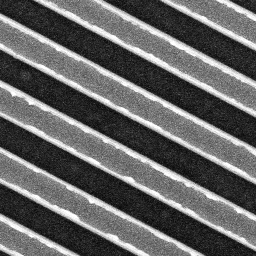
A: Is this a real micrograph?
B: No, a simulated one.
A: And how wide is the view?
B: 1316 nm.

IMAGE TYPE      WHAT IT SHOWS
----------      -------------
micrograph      parallel lines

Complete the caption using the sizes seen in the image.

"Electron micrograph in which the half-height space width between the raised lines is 156 nanometres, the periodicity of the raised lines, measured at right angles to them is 304 nanometres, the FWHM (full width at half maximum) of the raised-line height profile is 146 nm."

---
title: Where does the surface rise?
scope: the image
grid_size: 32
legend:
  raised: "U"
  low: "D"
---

DDDDDDUUUUUUUDDDDDDDDUUUUUUUUDDD
DDDDDDDUUUUUUUUDDDDDDDDUUUUUUUUD
UDDDDDDDDUUUUUUUUDDDDDDDDUUUUUUU
UUUDDDDDDDDUUUUUUUUDDDDDDDDUUUUU
UUUUUDDDDDDDDUUUUUUUUDDDDDDDDUUU
UUUUUUUDDDDDDDDUUUUUUUUDDDDDDDDU
DUUUUUUUUDDDDDDDDUUUUUUUDDDDDDDD
DDDUUUUUUUUDDDDDDDDUUUUUUUDDDDDD
DDDDDUUUUUUUUDDDDDDDDUUUUUUUDDDD
DDDDDDDUUUUUUUDDDDDDDDDUUUUUUUDD
UDDDDDDDDUUUUUUUDDDDDDDDDUUUUUUU
UUDDDDDDDDDUUUUUUUDDDDDDDDUUUUUU
UUUUDDDDDDDDDUUUUUUUDDDDDDDDUUUU
UUUUUUDDDDDDDDUUUUUUUUDDDDDDDDUU
UUUUUUUUDDDDDDDDUUUUUUUUDDDDDDDD
DDUUUUUUUUDDDDDDDDUUUUUUUUDDDDDD
DDDDUUUUUUUUDDDDDDDDUUUUUUUUDDDD
DDDDDDUUUUUUUUDDDDDDDDUUUUUUUUDD
DDDDDDDDUUUUUUUUDDDDDDDDUUUUUUUD
UUDDDDDDDDUUUUUUUUDDDDDDDDUUUUUU
UUUUDDDDDDDDUUUUUUUDDDDDDDDDUUUU
UUUUUDDDDDDDDDUUUUUUUDDDDDDDDDUU
UUUUUUUDDDDDDDDDUUUUUUUDDDDDDDDU
DDUUUUUUUDDDDDDDDUUUUUUUUDDDDDDD
DDDDUUUUUUUDDDDDDDDUUUUUUUUDDDDD
DDDDDUUUUUUUUDDDDDDDDUUUUUUUUDDD
DDDDDDDUUUUUUUUDDDDDDDDUUUUUUUUD
UDDDDDDDDUUUUUUUUDDDDDDDDUUUUUUU
UUUDDDDDDDDUUUUUUUUDDDDDDDDUUUUU
UUUUUDDDDDDDDUUUUUUUUDDDDDDDDUUU
UUUUUUUDDDDDDDDUUUUUUUDDDDDDDDDU
DUUUUUUUUDDDDDDDDUUUUUUUDDDDDDDD